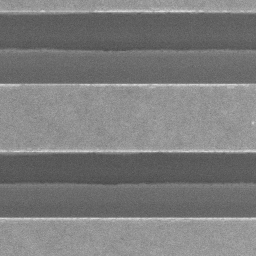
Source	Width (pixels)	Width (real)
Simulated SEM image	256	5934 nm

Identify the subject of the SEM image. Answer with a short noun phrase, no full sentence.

lines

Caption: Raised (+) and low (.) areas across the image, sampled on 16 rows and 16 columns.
++++++++++++++++
................
................
................
................
++++++++++++++++
++++++++++++++++
++++++++++++++++
++++++++++++++++
................
................
................
................
................
++++++++++++++++
++++++++++++++++